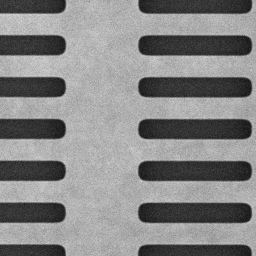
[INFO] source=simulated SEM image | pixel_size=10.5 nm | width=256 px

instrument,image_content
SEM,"groups of lines, slits or small figures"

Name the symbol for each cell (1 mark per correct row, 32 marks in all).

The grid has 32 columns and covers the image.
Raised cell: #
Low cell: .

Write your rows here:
........#########...............
........##########.............#
################################
################################
........##########.............#
........#########...............
........##########.............#
################################
################################
################################
........#########..............#
........#########..............#
################################
################################
################################
........#########..............#
........#########..............#
################################
################################
################################
........##########.............#
........#########...............
........##########.............#
################################
################################
........##########.............#
........#########...............
........##########.............#
################################
################################
.......############...........##
........#########..............#